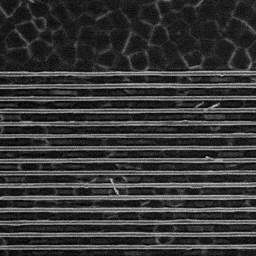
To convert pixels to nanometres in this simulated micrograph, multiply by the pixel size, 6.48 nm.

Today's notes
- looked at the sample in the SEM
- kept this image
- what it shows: parallel lines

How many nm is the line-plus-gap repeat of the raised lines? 80.3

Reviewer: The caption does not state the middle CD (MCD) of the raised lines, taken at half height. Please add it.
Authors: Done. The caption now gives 22.7 nm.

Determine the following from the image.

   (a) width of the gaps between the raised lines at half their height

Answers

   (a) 56.7 nanometres